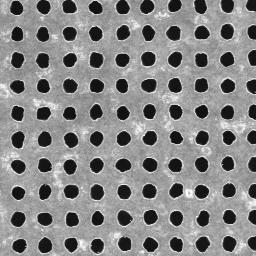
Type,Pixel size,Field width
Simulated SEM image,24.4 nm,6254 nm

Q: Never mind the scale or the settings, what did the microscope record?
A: a regular array of holes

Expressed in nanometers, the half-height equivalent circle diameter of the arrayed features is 348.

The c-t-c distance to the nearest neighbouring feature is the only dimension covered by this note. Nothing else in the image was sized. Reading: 627 nanometres